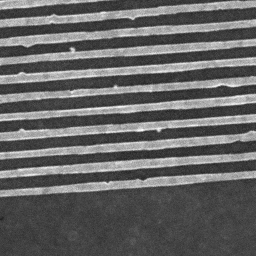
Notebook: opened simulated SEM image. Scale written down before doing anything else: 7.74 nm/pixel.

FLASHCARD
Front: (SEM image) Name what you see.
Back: parallel lines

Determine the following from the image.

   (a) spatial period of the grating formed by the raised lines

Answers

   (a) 0.146 um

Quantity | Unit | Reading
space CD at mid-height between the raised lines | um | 0.0897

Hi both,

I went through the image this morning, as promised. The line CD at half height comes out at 52.1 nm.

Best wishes